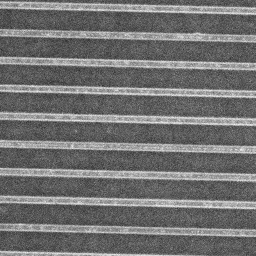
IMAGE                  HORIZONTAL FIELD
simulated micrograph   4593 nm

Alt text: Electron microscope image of parallel lines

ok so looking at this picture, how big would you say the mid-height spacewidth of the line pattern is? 386 nm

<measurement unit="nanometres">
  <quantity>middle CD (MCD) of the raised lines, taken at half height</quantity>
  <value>117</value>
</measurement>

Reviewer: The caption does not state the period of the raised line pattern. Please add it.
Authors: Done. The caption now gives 27.8 pixels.